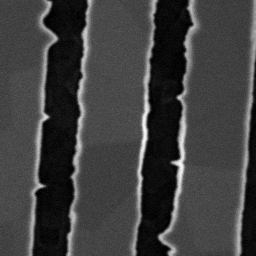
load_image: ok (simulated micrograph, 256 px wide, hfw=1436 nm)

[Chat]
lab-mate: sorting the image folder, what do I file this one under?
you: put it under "one or a few lines or trenches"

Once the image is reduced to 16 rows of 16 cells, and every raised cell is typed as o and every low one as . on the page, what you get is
ooo..ooooo..oooo
ooo..ooooo..oooo
ooo..ooooo..oooo
ooo..oooo...oooo
ooo..oooo...oooo
ooo..oooo..ooooo
ooo..oooo..ooooo
ooo..oooo..ooooo
ooo..oooo..ooooo
oo...oooo..oooo.
oo...oooo..oooo.
oo...oooo..oooo.
oo...oooo..oooo.
oo..ooooo..oooo.
oo..ooooo.ooooo.
oo..oooo..ooooo.